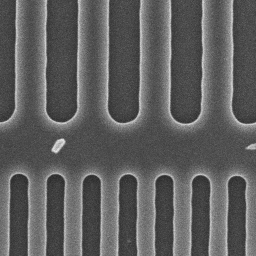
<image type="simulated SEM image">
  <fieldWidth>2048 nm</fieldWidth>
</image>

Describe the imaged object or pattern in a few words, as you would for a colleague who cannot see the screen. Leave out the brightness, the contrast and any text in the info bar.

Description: groups of lines, slits or small figures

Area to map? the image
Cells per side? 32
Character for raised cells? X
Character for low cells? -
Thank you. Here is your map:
--XXXX----XXXX----XXX----XXXX---
--XXXX----XXX-----XXX----XXXX---
--XXXX----XXX-----XXX----XXXX---
--XXXX----XXX-----XXX----XXXX---
--XXXX----XXX-----XXX----XXXX---
--XXXX----XXX-----XXX----XXXX---
--XXXX----XXX-----XXX----XXXX---
--XXXX----XXX-----XXX----XXXX---
--XXXX----XXX-----XXX----XXXX---
--XXXX----XXX-----XXX----XXXX---
--XXXX----XXX-----XXX----XXXX---
--XXXX----XXX-----XXX----XXXX---
--XXXX----XXX-----XXX----XXXX---
--XXXX----XXX-----XXX----XXXX---
-XXXXX---XXXXX---XXXX----XXXX---
XXXXXXXXXXXXXXXXXXXXXXX-XXXXXXXX
XXXXXXXXXXXXXXXXXXXXXXXXXXXXXXXX
XXXXXXXXXXXXXXXXXXXXXXXXXXXXXXXX
XXXXXXXXXXXXXXXXXXXXXXXXXXXXXXXX
XXXXXXXXXXXXXXXXXXXXXXXXXXXXXXXX
XXXXXXXXXXXXXXXXXXXXXXXXXXXXXXXX
XXXXXXXXXXXXXXXXXXXXXXXXXXXXXXXX
X---XX--XX---XX--XXX--XX--XXX--X
X---XX--XX---XX--XX---XX--XX---X
X---XX--XX---XX--XX---XX--XX---X
X---XX--XX---XX--XX---XX--XX---X
X---XX--XX---XX--XX---XX--XX---X
X---XX--XX---XX--XX---XX--XX---X
X---XX--XX---XX--XX---XX--XX---X
X---XX--XX---XX--XX---XX--XX---X
X---XX--XX---XX--XX---XX--XX---X
X---XX--XX---XX--XX---XX--XX---X